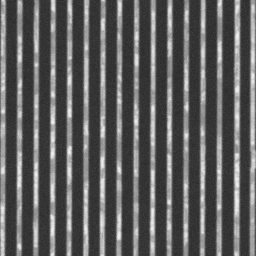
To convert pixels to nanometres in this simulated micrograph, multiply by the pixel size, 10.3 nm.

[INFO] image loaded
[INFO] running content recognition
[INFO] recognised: parallel lines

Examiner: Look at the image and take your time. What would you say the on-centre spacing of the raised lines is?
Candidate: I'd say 172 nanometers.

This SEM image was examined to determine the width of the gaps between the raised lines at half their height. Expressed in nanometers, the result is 126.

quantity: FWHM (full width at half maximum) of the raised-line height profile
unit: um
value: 0.0386